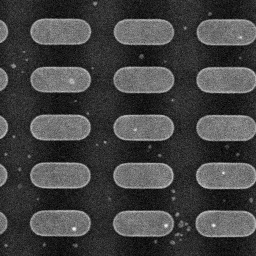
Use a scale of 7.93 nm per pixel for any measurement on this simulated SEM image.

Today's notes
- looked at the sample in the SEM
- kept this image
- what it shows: groups of lines, slits or small figures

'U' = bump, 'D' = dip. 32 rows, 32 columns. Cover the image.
DDDDDDDDDDDDDDDDDDDDDDDDDDDDDDDD
DDDDDDDDDDDDDDDDDDDDDDDDDDDDDDDD
DDDDDUUUUUDDDDDDUUUUDDDDDDDDDDDD
UDDDUUUUUUUDDDUUUUUUUUDDDUUUUUUU
UDDDUUUUUUUDDDUUUUUUUUDDDUUUUUUU
DDDDDUUUUUDDDDDUUUUUUDDDDDUUUUUD
DDDDDDDDDDDDDDDDDDDDDDDDDDDDDDDD
DDDDDDDDDDDDDDDDDDDDDDDDDDDDDDDD
DDDDDUUUUUDDDDDUUUUUUDDDDDUUUUUD
UDDDUUUUUUUDDDUUUUUUUUDDDUUUUUUU
UDDDUUUUUUUDDDUUUUUUUUDDDUUUUUUU
DDDDDDDDDDDDDDDDUUUUDDDDDDUUUUUD
DDDDDDDDDDDDDDDDDDDDDDDDDDDDDDDD
DDDDDDDDDDDDDDDDDDDDDDDDDDDDDDDD
DDDDDUUUUUDDDDDUUUUUUDDDDDUUUUUD
UDDDUUUUUUUDDDUUUUUUUUDDDUUUUUUU
UDDDUUUUUUUDDDUUUUUUUUDDDUUUUUUU
DDDDDDDDDDDDDDDDUUUUDDDDDDUUUUUD
DDDDDDDDDDDDDDDDDDDDDDDDDDDDDDDD
DDDDDDDDDDDDDDDDDDDDDDDDDDDDDDDD
DDDDDUUUUUDDDDDDUUUUDDDDDDUUUUUD
UDDDUUUUUUUDDDUUUUUUUUDDDUUUUUUU
UDDDUUUUUUUDDDUUUUUUUUDDDUUUUUUU
DDDDDDDDDDDDDDDDDDDDDDDDDDDDDDDD
DDDDDDDDDDDDDDDDDDDDDDDDDDDDDDDD
DDDDDDDDDDDDDDDDDDDDDDDDDDDDDDDD
DDDDDUUUUUDDDDDUUUUUUDDDDUUUUUUD
UDDDUUUUUUUDDDUUUUUUUUDDDUUUUUUU
UDDDUUUUUUUDDDUUUUUUUUDDDUUUUUUU
DDDDDDDDDDDDDDDDDUUUDDDDDDUUUUUD
DDDDDDDDDDDDDDDDDDDDDDDDDDDDDDDD
DDDDDDDDDDDDDDDDDDDDDDDDDDDDDDDD